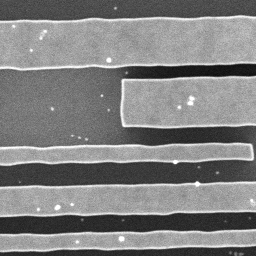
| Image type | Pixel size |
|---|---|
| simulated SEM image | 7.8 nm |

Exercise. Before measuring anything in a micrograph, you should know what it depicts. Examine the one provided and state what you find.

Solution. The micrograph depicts groups of lines, slits or small figures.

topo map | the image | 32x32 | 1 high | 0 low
00000000000000000000000000000000
00000000000000000000000000000000
00000000001111111111111111111111
11111111111111111111111111111111
11111111111111111111111111111111
11111111111111111111111111111111
11111111111111111111111111111111
11111111111111111111111111111111
11111110000000000000000000000000
00000000000000000000000000000000
00000000000000011111111111111111
00000000000000011111111111111111
00000000000000011111111111111111
00000000000000011111111111111111
00000000000000011111111111111111
00000000000000011111111111111111
00000000000000000000000000000000
00000000000000000000000000000000
11111011111111111111111111111111
11111111111111111111111111111111
11100000000000000000000000000000
00000000000000000000000000000000
00000000000000000000000000000000
11111111111111111111111111111111
11111111111111111111111111111111
11111111111111111111111111111111
11111111111111111111111111111111
00000000000000000000000000000000
00000000000000000000000000000000
11111111111111111111111111111111
11111111111111111111111111111111
10000000000000000000000000000000